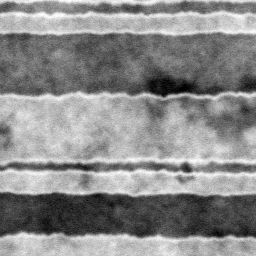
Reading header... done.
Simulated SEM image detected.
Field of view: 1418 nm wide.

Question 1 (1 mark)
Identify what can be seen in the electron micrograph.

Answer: lines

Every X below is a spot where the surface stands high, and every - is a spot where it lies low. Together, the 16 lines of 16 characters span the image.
XXXXXXXXXXXXXXXX
XXXXXXXXXXXXXXXX
----------------
----------------
----------------
----------------
XXXXXXXXXXXXXXXX
XXXXXXXXXXXXXXXX
XXXXXXXXXXXXXXXX
XXXXXXXXXXXXXXXX
XXXXXXXXXXXXXXXX
XXXXXXXXXXXXXXXX
----------------
----------------
----------------
XXXXXXXXXXXXXXXX